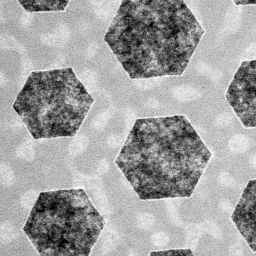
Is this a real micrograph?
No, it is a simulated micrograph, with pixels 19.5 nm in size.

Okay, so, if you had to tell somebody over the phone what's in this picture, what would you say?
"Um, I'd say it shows holes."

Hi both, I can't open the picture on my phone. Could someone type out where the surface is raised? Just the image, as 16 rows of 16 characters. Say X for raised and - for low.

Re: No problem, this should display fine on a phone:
X---XXX-----XXXX
XXXXXXX------XXX
XXXXXXX------XXX
XXXXXXX-----XXXX
XX---XXX---XXXX-
X----XXXXXXXXX--
X-----XXXXXXXX--
X----XXXX---XXX-
XX--XXXX----XXXX
XXXXXXX------XXX
XXXXXXX------XXX
XXXXXXXX----XXX-
XX----XXXX-XXXX-
XX----XXXXXXXXX-
XX-----XXXXXXXX-
XX----XXXXXXXXXX